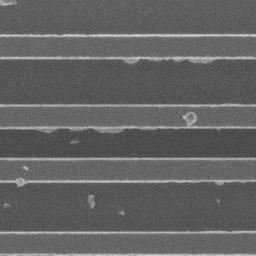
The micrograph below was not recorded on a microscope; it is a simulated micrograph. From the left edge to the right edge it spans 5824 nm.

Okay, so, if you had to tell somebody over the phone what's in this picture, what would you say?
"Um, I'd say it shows lines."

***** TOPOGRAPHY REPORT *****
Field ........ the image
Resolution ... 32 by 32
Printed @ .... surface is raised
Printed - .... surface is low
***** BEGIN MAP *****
--------------------------------
--------------------------------
--------------------------------
--------------------------------
@@@@@@@@@@@@@@@@@@@@@@@@@@@@@@@@
@@@@@@@@@@@@@@@@@@@@@@@@@@@@@@@@
@@@@@@@@@@@@@@@@@@@@@@@@@@@@@@@@
--------------------------------
--------------------------------
--------------------------------
--------------------------------
--------------------------------
--------------------------------
@@@@@@@@@@@@@@@@@@@@@@@@@@@@@@@@
@@@@@@@@@@@@@@@@@@@@@@@@@@@@@@@@
@@@@@@@@@@@@@@@@@@@@@@@@@@@@@@@@
--------------------------------
--------------------------------
--------------------------------
--------------------------------
@@@@@@@@@@@@@@@@@@@@@@@@@@@@@@@@
@@@@@@@@@@@@@@@@@@@@@@@@@@@@@@@@
@@@@@@@@@@@@@@@@@@@@@@@@@@@@@@@@
--------------------------------
--------------------------------
--------------------------------
--------------------------------
--------------------------------
--------------------------------
@@@@@@@@@@@@@@@@@@@@@@@@@@@@@@@@
@@@@@@@@@@@@@@@@@@@@@@@@@@@@@@@@
@@@@@@@@@@@@@@@@@@@@@@@@@@@@@@@@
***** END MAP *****